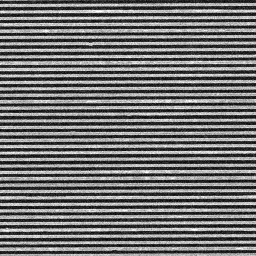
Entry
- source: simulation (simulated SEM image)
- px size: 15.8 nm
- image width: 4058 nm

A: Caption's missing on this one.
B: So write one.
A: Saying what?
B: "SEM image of parallel lines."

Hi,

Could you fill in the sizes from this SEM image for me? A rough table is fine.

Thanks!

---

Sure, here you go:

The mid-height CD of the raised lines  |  41.6 nanometres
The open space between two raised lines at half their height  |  0.0614 micrometres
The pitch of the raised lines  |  102 nm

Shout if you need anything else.